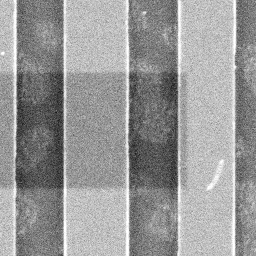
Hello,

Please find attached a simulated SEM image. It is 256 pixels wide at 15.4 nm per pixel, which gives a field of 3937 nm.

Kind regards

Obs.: lines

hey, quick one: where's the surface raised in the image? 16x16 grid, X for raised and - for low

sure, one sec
X---XXXX---XXXX-
X---XXXX---XXXX-
X---XXXX---XXXX-
X---XXXX---XXXX-
X---XXXX---XXXX-
X---XXXX---XXXX-
X---XXXX---XXXX-
X---XXXX---XXXX-
X---XXXX---XXXX-
X---XXXX---XXXX-
X---XXXX---XXXX-
X---XXXX---XXXX-
X---XXXX---XXXX-
X---XXXX---XXXX-
X---XXXX---XXXX-
X---XXXX---XXXX-